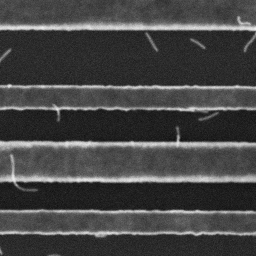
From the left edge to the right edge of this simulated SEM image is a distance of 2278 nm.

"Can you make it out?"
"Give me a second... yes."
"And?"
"lines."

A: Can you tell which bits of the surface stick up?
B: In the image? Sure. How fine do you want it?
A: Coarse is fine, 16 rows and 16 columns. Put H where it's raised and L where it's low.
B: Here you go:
HHHHHHHHHHHHHHHH
HHHHHHHHHHHHHHHH
LLLLLLLLLLLLLLLL
LLLLLLLLLLLLLLLL
LLLLLLLLLLLLLLLL
HHHHHHHHHHHHHHHH
HHHHHHHHHHHHHHHH
LLLLLLLLLLLLLLLL
LLLLLLLLLLLLLLLL
HHHHHHHHHHHHHHHH
HHHHHHHHHHHHHHHH
LLLLLLLLLLLLLLLL
LLLLLLLLLLLLLLLL
HHHHHHHHHHHHHHHH
HHHHHHHHHHHHHHHH
LLLLLLLLLLLLLLLL